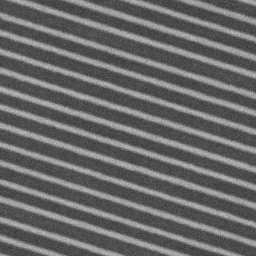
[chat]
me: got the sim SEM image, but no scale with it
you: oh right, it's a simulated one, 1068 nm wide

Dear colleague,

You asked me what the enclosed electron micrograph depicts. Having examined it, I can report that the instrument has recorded parallel lines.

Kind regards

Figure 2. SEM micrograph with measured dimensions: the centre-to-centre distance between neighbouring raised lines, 73.8 nm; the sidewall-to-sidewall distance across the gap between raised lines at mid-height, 54.6 nm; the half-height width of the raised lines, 0.0184 micrometres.